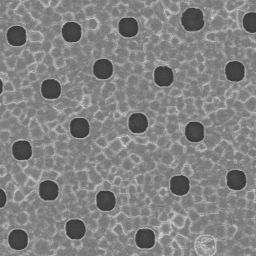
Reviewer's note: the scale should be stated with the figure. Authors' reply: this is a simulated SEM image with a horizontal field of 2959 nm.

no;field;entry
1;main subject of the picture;a regular array of holes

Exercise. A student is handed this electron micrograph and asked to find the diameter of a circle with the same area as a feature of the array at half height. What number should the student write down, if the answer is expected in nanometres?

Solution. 246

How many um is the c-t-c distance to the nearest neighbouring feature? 0.618